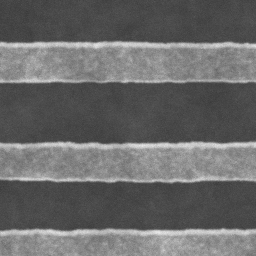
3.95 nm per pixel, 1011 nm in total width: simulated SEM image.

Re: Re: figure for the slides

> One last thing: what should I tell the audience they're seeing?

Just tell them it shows lines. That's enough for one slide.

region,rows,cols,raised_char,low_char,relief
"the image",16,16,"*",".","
................
................
................
****************
****************
................
................
................
................
****************
****************
................
................
................
.**..****..*****
****************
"